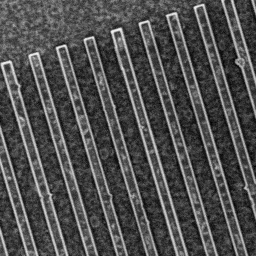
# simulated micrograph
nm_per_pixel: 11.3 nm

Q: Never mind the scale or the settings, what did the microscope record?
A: parallel lines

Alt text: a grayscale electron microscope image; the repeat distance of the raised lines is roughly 324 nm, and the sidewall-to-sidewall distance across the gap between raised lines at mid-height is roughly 223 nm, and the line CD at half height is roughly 9.36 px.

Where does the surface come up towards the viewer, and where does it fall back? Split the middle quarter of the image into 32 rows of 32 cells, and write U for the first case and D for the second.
UUDDDDDUUDDDDDUUUDDDDDUUDDDDDUUU
UUDDDDDUUUDDDDDUUDDDDDUUUDDDDDUU
UUUDDDDUUUDDDDDUUDDDDDUUUDDDDDUU
UUUDDDDDUUDDDDDUUUDDDDDUUDDDDDUU
DUUDDDDDUUDDDDDDUUDDDDDUUUDDDDDU
DUUDDDDDUUUDDDDDUUDDDDDUUUDDDDDU
DUUUDDDDDUUDDDDDUUUDDDDDUUDDDDDU
DDUUDDDDDUUDDDDDDUUDDDDDUUUDDDDU
DDUUDDDDDUUUDDDDDUUDDDDDUUUDDDDD
DDUUUDDDDDUUDDDDDUUUDDDDUUUDDDDD
DDUUUDDDDDUUDDDDDUUUDDDDDUUDDDDD
DDDUUDDDDDUUUDDDDDUUDDDDDUUUDDDD
DDDUUDDDDDUUUDDDDDUUDDDDDUUUDDDD
DDDUUUDDDDDUUDDDDDUUUDDDDDUUDDDD
DDDDUUDDDDDUUUDDDDDUUDDDDDUUUDDD
DDDDUUDDDDDUUUDDDDDUUDDDDDUUUDDD
DDDDUUUDDDDDUUDDDDDUUUDDDDUUUDDD
DDDDDUUDDDDDUUUDDDDUUUDDDDDUUDDD
DDDDDUUDDDDDUUUDDDDDUUDDDDDUUUDD
DDDDDUUUDDDDUUUDDDDDUUDDDDDUUUDD
DDDDDUUUDDDDDUUDDDDDUUUDDDDDUUDD
UDDDDDUUDDDDDUUUDDDDDUUDDDDDUUUD
UDDDDDUUDDDDDUUUDDDDDUUDDDDDUUUD
UDDDDDUUUDDDDDUUDDDDDUUUDDDDDUUD
UDDDDDDUUDDDDDUUUDDDDUUUDDDDDUUD
UUDDDDDUUDDDDDUUUDDDDDUUDDDDDUUU
UUDDDDDUUUDDDDDUUDDDDDUUDDDDDUUU
UUDDDDDUUUDDDDDUUDDDDDUUUDDDDDUU
UUUDDDDDUUDDDDDUUUDDDDDUUDDDDDUU
UUUDDDDDUUDDDDDUUUDDDDDUUDDDDDDU
DUUDDDDDUUUDDDDDUUDDDDDUUUDDDDDU
DUUDDDDDDUUDDDDDUUDDDDDDUUDDDDDU